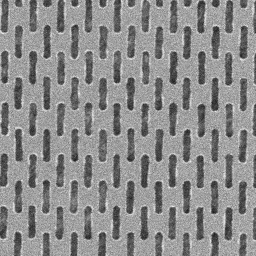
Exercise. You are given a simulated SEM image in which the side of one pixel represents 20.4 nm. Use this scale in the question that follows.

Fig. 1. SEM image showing a regular array of holes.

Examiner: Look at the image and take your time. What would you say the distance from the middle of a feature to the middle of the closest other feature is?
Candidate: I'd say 568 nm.